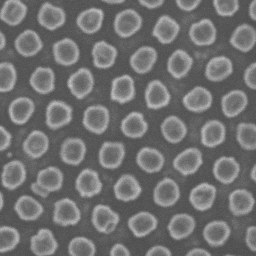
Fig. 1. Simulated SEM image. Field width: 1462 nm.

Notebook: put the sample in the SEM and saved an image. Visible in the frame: a regular array of raised bodies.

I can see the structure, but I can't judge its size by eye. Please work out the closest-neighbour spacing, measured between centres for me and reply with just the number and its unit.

206 nm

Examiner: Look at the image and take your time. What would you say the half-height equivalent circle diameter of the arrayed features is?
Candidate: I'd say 0.138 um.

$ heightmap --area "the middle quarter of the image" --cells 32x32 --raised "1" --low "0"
00000000111000000111110000111110
00001000000000000011100000111110
00011100000000000000000000011100
00111110000000110000000000000000
01111110000011111000000000000000
01111110000011111000011110000000
00111110000011111000011110000000
00011000000011111000011111000000
00000000000011111000011111000011
00000000000000100000011111000011
00000000000000000000011100000001
10000011111000000000000000000000
10000111111000000100000000000000
10000111111000001110000000010000
00000111111000011111000001111000
00000011111000011111000011111100
00000001110000011111000001111100
00000000000000011110000001111100
00000000000000000000000000111100
01110000000000000000000000000000
11111000001111000000000000000000
11111000011111100000100000000000
11111000011111100001111100000011
11111000011111000011111100001111
01110000011111000001111110001111
00000000001110000001111100001111
00000000000000000000111000000111
00001111000000000000000000000000
00001111000000011000000000000000
00011111100000111100000001100000
00011111100001111110000111110000
00001111100001111110000111110000